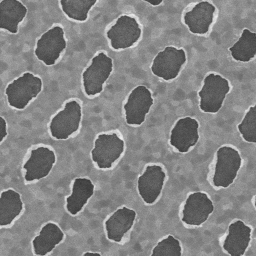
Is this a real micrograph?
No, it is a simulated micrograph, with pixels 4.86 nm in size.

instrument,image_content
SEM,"a regular array of holes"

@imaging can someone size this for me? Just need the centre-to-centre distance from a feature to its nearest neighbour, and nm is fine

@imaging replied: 247